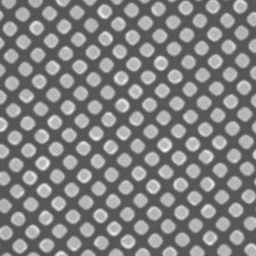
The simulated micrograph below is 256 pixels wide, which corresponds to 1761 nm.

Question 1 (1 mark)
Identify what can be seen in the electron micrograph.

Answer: a regular array of raised bodies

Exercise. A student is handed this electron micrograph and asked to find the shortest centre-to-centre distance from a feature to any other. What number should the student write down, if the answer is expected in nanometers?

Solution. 130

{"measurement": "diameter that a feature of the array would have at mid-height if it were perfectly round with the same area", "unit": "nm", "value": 90.2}